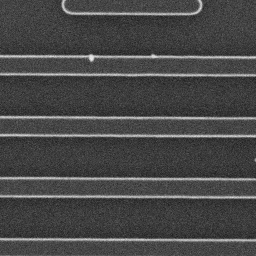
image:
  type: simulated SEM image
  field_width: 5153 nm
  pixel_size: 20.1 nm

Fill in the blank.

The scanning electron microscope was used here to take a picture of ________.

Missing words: groups of lines, slits or small figures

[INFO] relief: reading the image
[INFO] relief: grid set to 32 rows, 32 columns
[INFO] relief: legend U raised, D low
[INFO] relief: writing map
DDDDDDDDUUUUUUUUUUUUUUUUUDDDDDDD
DDDDDDDDUUUUUUUUUUUUUUUUUDDDDDDD
DDDDDDDDDDDDDDDDDDDDDDDDDDDDDDDD
DDDDDDDDDDDDDDDDDDDDDDDDDDDDDDDD
DDDDDDDDDDDDDDDDDDDDDDDDDDDDDDDD
DDDDDDDDDDDDDDDDDDDDDDDDDDDDDDDD
DDDDDDDDDDDDDDDDDDDDDDDDDDDDDDDD
UUUUUUUUUUUUUUUUUUUUUUUUUUUUUUUU
UUUUUUUUUUUUUUUUUUUUUUUUUUUUUUUU
DDDDDDDDDDDDDDDDDDDDDDDDDDDDDDDD
DDDDDDDDDDDDDDDDDDDDDDDDDDDDDDDD
DDDDDDDDDDDDDDDDDDDDDDDDDDDDDDDD
DDDDDDDDDDDDDDDDDDDDDDDDDDDDDDDD
DDDDDDDDDDDDDDDDDDDDDDDDDDDDDDDD
DDDDDDDDDDDDDDDDDDDDDDDDDDDDDDDD
UUUUUUUUUUUUUUUUUUUUUUUUUUUUUUUU
UUUUUUUUUUUUUUUUUUUUUUUUUUUUUUUU
DDDDDDDDDDDDDDDDDDDDDDDDDDDDDDDD
DDDDDDDDDDDDDDDDDDDDDDDDDDDDDDDD
DDDDDDDDDDDDDDDDDDDDDDDDDDDDDDDD
DDDDDDDDDDDDDDDDDDDDDDDDDDDDDDDD
DDDDDDDDDDDDDDDDDDDDDDDDDDDDDDDD
UUUUUUUUUUUUUUUUUUUUUUUUUUUUUUUU
UUUUUUUUUUUUUUUUUUUUUUUUUUUUUUUU
UUUUUUUUUUUUUUUUUUUUUUUUUUUUUUUU
DDDDDDDDDDDDDDDDDDDDDDDDDDDDDDDD
DDDDDDDDDDDDDDDDDDDDDDDDDDDDDDDD
DDDDDDDDDDDDDDDDDDDDDDDDDDDDDDDD
DDDDDDDDDDDDDDDDDDDDDDDDDDDDDDDD
DDDDDDDDDDDDDDDDDDDDDDDDDDDDDDDD
UUUUUUUUUUUUUUUUUUUUUUUUUUUUUUUU
UUUUUUUUUUUUUUUUUUUUUUUUUUUUUUUU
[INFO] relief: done